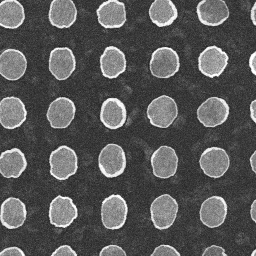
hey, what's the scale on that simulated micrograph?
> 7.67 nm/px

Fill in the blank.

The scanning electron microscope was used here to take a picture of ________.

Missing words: a regular array of raised bodies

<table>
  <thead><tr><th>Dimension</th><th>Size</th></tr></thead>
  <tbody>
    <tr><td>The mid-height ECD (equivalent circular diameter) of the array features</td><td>0.225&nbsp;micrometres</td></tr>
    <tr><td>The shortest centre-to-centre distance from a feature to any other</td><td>379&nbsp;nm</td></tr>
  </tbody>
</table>